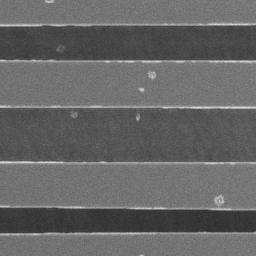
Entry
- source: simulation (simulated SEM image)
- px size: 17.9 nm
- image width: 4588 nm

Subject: lines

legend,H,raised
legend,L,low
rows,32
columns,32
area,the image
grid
HHHHHHHHHHHHHHHHHHHHHHHHHHHHHHHH
HHHHHHHHHHHHHHHHHHHHHHHHHHHHHHHH
HHHHHHHHHHHHHHHHHHHHHHHHHHHHHHHH
LLLLLLLLLLLLLLLLLLLLLLLLLLLLLLLL
LLLLLLLLLLLLLLLLLLLLLLLLLLLLLLLL
LLLLLLLLLLLLLLLLLLLLLLLLLLLLLLLL
LLLLLLLLLLLLLLLLLLLLLLLLLLLLLLLL
LLLLLLLLLLLLLLLLLLLLLLLLLLLLLLLL
HHHHHHHHHHHHHHHHHHHHHHHHHHHHHHHH
HHHHHHHHHHHHHHHHHHHHHHHHHHHHHHHH
HHHHHHHHHHHHHHHHHHHHHHHHHHHHHHHH
HHHHHHHHHHHHHHHHHHHHHHHHHHHHHHHH
HHHHHHHHHHHHHHHHHHHHHHHHHHHHHHHH
LLLLLLLLLLLLLLLLLLLLLLLLLLLLLLLL
LLLLLLLLLLLLLLLLLLLLLLLLLLLLLLLL
LLLLLLLLLLLLLLLLLLLLLLLLLLLLLLLL
LLLLLLLLLLLLLLLLLLLLLLLLLLLLLLLL
LLLLLLLLLLLLLLLLLLLLLLLLLLLLLLLL
LLLLLLLLLLLLLLLLLLLLLLLLLLLLLLLL
LLLLLLLLLLLLLLLLLLLLLLLLLLLLLLLL
HHHHHHHHHHHHHHHHHHHHHHHHHHHHHHHH
HHHHHHHHHHHHHHHHHHHHHHHHHHHHHHHH
HHHHHHHHHHHHHHHHHHHHHHHHHHHHHHHH
HHHHHHHHHHHHHHHHHHHHHHHHHHHHHHHH
HHHHHHHHHHHHHHHHHHHHHHHHHHHHHHHH
HHHHHHHHHHHHHHHHHHHHHHHHHHHHHHHH
LLLLLLLLLLLLLLLLLLLLLLLLLLLLLLLL
LLLLLLLLLLLLLLLLLLLLLLLLLLLLLLLL
LLLLLLLLLLLLLLLLLLLLLLLLLLLLLLLL
HHHHHHHHHHHHHHHHHHHHHHHHHHHHHHHH
HHHHHHHHHHHHHHHHHHHHHHHHHHHHHHHH
HHHHHHHHHHHHHHHHHHHHHHHHHHHHHHHH